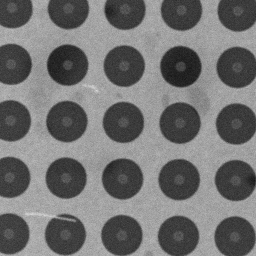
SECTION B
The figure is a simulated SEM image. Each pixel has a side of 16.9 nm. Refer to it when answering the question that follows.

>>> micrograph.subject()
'an array of small figures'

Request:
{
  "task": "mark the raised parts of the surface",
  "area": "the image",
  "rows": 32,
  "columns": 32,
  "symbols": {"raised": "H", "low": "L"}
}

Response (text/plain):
LLLLHHLLLLLHHLLLLLHHLLLLLHHLLLLL
LLLLHHLLLLLHHLLLLLHHLLLLLHHLLLLL
LLLLHHLLLLLHHLLLLLHHLLLLLHHLLLLL
HLHHHHHHLLHHHHLLLHHHHLLLHHHHLLLH
HHHHHHHHHHHHHHHHHHHHHHHHHHHHHHHH
HLHHHHHHLHHHHHHHHHHHHHHHHHHHHHHH
LLLHHHLLLLHHHHLLLHHHHLLLHHHHLLLH
LLLLHHLLLLLHHLLLLLHHLLLLLHHLLLLL
LLLLHHLLLLLHHLLLLLHHLLLLLHHLLLLL
LLLLHHLLLLLHHLLLLLHHLLLLLHHLLLLL
LLHHHHHLLLHHHHLLLHHHHLLLHHHHLLLH
HHHHHHHHHHHHHHHHHHHHHHHHHHHHHHHH
HLHHHHHHHHHHHHHHHHHHHHHHHHHHHHHH
LLLHHHLLLLHHHHLLLHHHHLLLHHHHLLLH
LLLLHHLLLLLHHLLLLLHHLLLLLHHLLLLL
LLLLHHLLLLLHHLLLLLHHLLLLLHHLLLLL
LLLLHHLLLLLHHLLLLLHHLLLLLHHLLLLL
LLHHHHHLLLHHHHLLLHHHHLLLHHHHLLLH
HHHHHHHHHHHHHHHHHHHHHHHHHHHHHHHH
HHHHHHHHHHHHHHHHHHHHHHHHHHHHHHHH
LLLHHHLLLLHHHLLLLHHHHLLLHHHHLLLH
LLLLHHLLLLLHHLLLLLHHLLLLLHHLLLLL
LLLLHHLLLLLHHLLLLLHHLLLLLHHLLLLL
LLLHHHLLLLLHHLLLLLHHLLLLLHHLLLLL
LLHHHHHLLLHHHHLLLHHHHLLLHHHHLLLH
HHHHHHHHHHHHHHHHHHHHHHHHHHHHHHHH
HHHHHHHHHHHHHHHHHHHHHHHHHHHHHHHH
LLLHHHLLLLHHHLLLLHHHHLLLHHHHLLLH
LLLLHHLLLLLHHLLLLLHHLLLLLHHLLLLL
LLLLHHLLLLLHHLLLLLHHLLLLLHHLLLLL
LLLHHHLLLLHHHLLLLLHHLLLLLHHLLLLL
LLHHHHHLLLHHHHLLLHHHHLLLHHHLLLLH